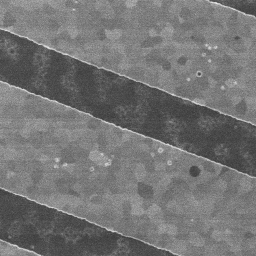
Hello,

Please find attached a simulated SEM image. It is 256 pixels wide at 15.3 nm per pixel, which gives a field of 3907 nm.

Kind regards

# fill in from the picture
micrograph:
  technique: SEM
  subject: one or a few lines or trenches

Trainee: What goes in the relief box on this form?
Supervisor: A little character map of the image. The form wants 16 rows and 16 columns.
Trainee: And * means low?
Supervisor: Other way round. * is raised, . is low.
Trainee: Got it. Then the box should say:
**************..
****************
..**************
....************
.......*********
*.........******
****........****
******.........*
*********.......
************....
**************..
****************
..**************
.....***********
.......*********
*.........******